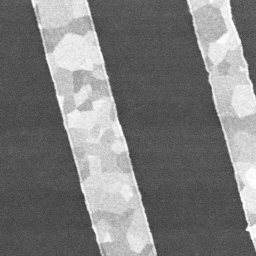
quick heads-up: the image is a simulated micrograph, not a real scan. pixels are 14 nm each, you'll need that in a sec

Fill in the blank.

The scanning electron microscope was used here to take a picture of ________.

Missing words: one or a few lines or trenches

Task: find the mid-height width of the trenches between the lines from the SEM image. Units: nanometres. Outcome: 1370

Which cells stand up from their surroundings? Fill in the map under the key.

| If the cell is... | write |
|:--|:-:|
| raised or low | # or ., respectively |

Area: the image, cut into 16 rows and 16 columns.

..####......##..
..####......###.
...###......###.
...###.......##.
...####......##.
...####......###
....###......###
....###.......##
....####......##
.....###......##
.....###.......#
.....####......#
.....####......#
......###......#
......###.......
......####......